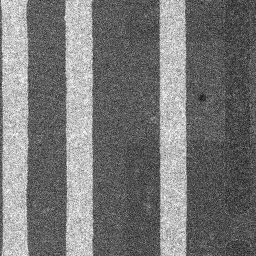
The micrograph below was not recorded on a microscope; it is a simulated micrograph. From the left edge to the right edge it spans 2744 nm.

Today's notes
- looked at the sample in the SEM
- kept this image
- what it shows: one or a few lines or trenches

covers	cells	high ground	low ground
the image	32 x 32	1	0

11100000111000000000111000001110
11100000111000000000111000001110
11100000111000000000111000001110
11100000111000000000111000001110
11100000111000000000111000001110
11100000111100000000111000001110
11100000111100000000111000001110
11100000111000000000111000001110
11100000111000000000111000001110
11100000111100000000111000001110
11100000111100000000111000001110
11100000111000000000111000001110
11100000111000000000111000001110
11100000111100000000111000001110
11100000111000000000111000001110
11100000111000000000111000001110
01100000111000000000111000001110
11100000111000000000111000001110
11100000111000000000111000001110
11100000111100000000111000001110
11100000111100000000111000001110
11100000111100000000111000001110
11100000111000000000111000001110
11100000111000000000111000001110
11100000111100000000111000001110
11100000111100000000111000001110
11100000111000000000111000001110
11100000111100000000111000000000
11100000111100000000111000000000
11100000111100000000111000000000
11100000111000000000111000001110
11100000111100000000111000001110